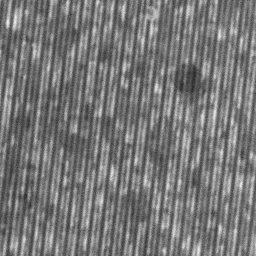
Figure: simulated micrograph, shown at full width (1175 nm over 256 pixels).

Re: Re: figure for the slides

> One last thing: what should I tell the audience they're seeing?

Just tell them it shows parallel lines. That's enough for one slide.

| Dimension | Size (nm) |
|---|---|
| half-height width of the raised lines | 30.2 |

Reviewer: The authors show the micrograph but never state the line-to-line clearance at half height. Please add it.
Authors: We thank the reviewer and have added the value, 0.0233 micrometres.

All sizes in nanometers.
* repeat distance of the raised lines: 52.2